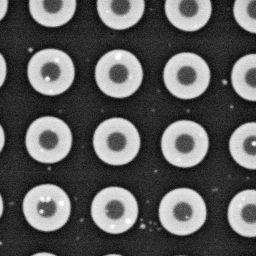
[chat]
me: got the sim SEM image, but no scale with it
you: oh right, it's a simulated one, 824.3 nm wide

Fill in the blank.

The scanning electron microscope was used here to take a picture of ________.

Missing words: an array of small figures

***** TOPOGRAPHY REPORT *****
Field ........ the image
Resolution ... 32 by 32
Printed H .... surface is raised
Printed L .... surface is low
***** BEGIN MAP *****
HLLLHHHHHLLLHHHHHHLLLHHHHHLLLHHH
HLLLHHHHHLLLHHHHHHLLLHHHHHLLLHHH
LLLLHHHHHLLLLHHHHLLLLHHHHHLLLHHH
LLLLLLLLLLLLLLHHLLLLLLHHHLLLLLHH
LLLLLLLLLLLLLLLLLLLLLLLLLLLLLLLL
LLLLLLLLLLLLLLLLLLLLLLLLLLLLLLLL
LLLLLHHHLLLLLLHHLLLLLLLLLLLLLLLL
HLLLHHHHHLLLHHHHHLLLLHHHHLLLLLHH
HLLHHHHHHLLLHHHHHHLLLHHHHHLLLHHH
HLLLHHHHHLLLHHHHHHLLHHHHHHLLLHHH
LLLLHHHHHLLLHHHHHHLLLHHHHHLLLHHH
LLLLLHHHLLLLLHHHHLLLLHHHHLLLLLHH
LLLLLLLLLLLLLLLLLLLLLLLLLLLLLLLH
LLLLLLLLLLLLLLLLLLLLLLLLLLLLLLLL
LLLLLLLLLLLLLLLLLLLLLLLLLLLLLLLL
LLLLHHHHLLLLLHHHLLLLLLHHHLLLLLLH
LLLHHHHHHLLLHHHHHLLLLHHHHHLLLHHH
HLLHHHHHHLLLHHHHHLLLHHHHHHLLLHHH
LLLHHHHHHLLLHHHHHLLLHHHHHHLLLHHH
LLLLHHHHLLLLHHHHHLLLLHHHHHLLLHHH
LLLLLLLLLLLLLLHHLLLLLLHHHLLLLLHH
LLLLLLLLLLLLLLLLLLLLLLLLLLLLLLLL
LLLLLLLLLLLLLLLLLLLLLLLLLLLLLLLL
LLLLHHHLLLLLLHHLLLLLLLLLLLLLLLLL
LLLHHHHHLLLLHHHHHLLLLHHHHLLLLHHH
LLLHHHHHHLLLHHHHHLLLHHHHHHLLLHHH
LLLHHHHHHLLHHHHHHLLLHHHHHHLLLHHH
LLLHHHHHLLLLHHHHHLLLHHHHHHLLLHHH
LLLLHHHLLLLLLHHHLLLLLHHHHLLLLHHH
LLLLLLLLLLLLLLLLLLLLLLLLLLLLLLLH
LLLLLLLLLLLLLLLLLLLLLLLLLLLLLLLL
LLLLLLLLLLLLLLLLLLLLLLLLLLLLLLLL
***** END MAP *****